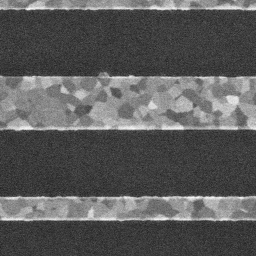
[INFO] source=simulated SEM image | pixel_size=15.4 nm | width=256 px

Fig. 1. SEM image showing lines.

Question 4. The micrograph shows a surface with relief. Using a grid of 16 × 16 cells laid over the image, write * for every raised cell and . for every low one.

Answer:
****************
................
................
................
................
****************
****************
****************
................
................
................
................
****************
****************
................
................